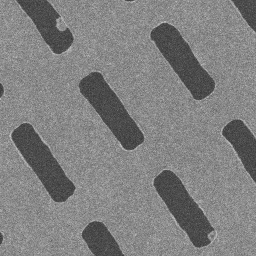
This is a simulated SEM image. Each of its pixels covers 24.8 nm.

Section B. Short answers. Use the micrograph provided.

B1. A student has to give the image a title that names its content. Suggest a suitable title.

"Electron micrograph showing holes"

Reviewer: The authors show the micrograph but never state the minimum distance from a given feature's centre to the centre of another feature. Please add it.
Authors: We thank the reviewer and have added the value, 2150 nm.